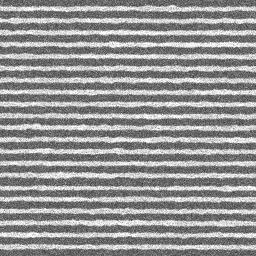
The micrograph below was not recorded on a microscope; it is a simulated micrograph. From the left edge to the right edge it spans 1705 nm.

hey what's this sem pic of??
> parallel lines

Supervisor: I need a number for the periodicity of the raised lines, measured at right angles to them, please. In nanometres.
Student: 79.4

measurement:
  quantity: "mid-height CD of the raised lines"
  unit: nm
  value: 29.1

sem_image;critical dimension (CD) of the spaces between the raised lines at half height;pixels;7.87